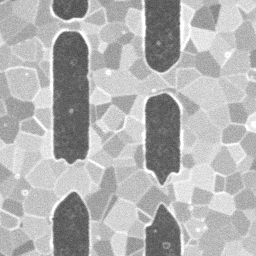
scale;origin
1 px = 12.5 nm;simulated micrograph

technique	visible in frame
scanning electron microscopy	one or a few lines or trenches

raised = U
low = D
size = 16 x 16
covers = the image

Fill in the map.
UUUDDDUUUDDUUUUU
UUUUUUUUUDDUUUUU
UUUDDUUUUDDUUUUU
UUUDDDUUUDDUUUUU
UUUDDDUUUUUUUUUU
UUUDDDUUUUUUUUUU
UUUDDDUUUDDUUUUU
UUUDDDUUUDDUUUUU
UUUDDDUUUDDUUUUU
UUUDDDUUUDDUUUUU
UUUUUUUUUDDUUUUU
UUUUUUUUUUUUUUUU
UUUUDUUUUUUUUUUU
UUUDDDUUUUDUUUUU
UUUDDDUUUDDUUUUU
UUUDDDUUUDDUUUUU